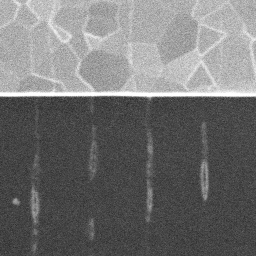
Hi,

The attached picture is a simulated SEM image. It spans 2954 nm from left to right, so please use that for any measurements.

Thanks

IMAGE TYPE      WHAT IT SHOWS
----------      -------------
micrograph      wiring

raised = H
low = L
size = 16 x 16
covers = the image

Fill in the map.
HHHHHHHHHHHHHHHH
HHHHHHHHHHHHHHHH
HHHHHHHHHHHHHHHH
HHHHHHHHHHHHHHHH
HHHHHHHHHHHHHHHH
HHHHHHHHHHHHHHHH
LLLLLLLLLLLLLLLL
LLLLLLLLLLLLLLLL
LLLLLLLLLLLLLLLL
LLLLLLLLLLLLLLLL
LLLLLLLLLLLLLLLL
LLLLLLLLLLLLLLLL
LLLLLLLLLLLLLLLL
LLLLLLLLLLLLLLLL
LLLLLLLLLLLLLLLL
LLLLLLLLLLLLLLLL